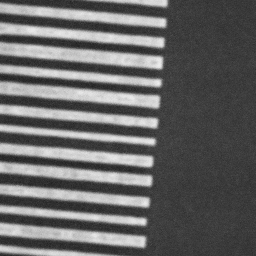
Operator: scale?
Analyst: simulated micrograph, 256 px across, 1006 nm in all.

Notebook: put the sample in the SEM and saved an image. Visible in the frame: parallel lines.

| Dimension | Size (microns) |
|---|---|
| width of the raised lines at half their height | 0.0372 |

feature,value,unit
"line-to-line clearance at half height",44.1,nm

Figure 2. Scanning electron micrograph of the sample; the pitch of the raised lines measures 78.5 nm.